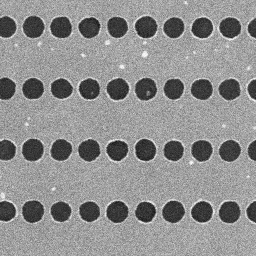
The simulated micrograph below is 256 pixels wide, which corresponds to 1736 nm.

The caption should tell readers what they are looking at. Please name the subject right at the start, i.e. a regular array of holes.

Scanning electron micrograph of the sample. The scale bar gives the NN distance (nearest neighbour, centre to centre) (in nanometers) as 189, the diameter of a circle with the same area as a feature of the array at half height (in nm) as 152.